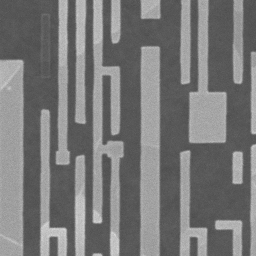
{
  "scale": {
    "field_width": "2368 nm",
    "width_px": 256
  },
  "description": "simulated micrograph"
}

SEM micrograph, wiring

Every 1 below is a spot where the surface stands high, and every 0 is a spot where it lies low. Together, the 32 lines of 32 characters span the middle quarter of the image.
10011000100000000001111100000110
10011000111111000001111100000110
10011000111111000001111100000110
10011000100011000001111100000110
10011000100011000001111100000110
10011000100011000001111100000000
10011001100011000001111100000000
10011001100011000001111100000000
10011001100011000001111100000000
10011001100011000001111100000000
10011001100011000001111100000000
10011001100011000001111100000000
10011001100011000001111100000000
10011001100011000001111100000000
10011001100011000001111100000001
10000001100011000001111100000001
10000001100011000001111100000001
10000001100010000001111100000001
10000001100000000001111100000001
10000001100100000001111100000000
10000001111111100001111100000000
10000001111111100001111100000000
10000001110111100001111100000110
10011001100011000001111100000110
10011001100011000001111100000110
00011001100011000001111100000110
00011001100011000001111100000110
00011001100011000001111100000110
00011001100011000001111100000110
00011001100011000001111100000110
00011001100011000001111100000110
00011001100011000001111100000110